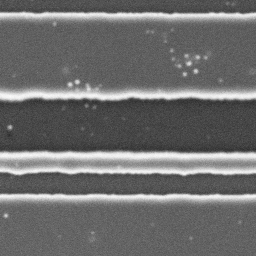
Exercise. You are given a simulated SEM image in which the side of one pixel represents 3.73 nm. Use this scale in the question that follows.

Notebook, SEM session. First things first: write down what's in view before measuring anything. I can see lines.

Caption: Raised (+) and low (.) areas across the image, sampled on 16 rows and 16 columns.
++++++++++++++++
++++++++++++++++
++++++++++++++++
++++++++++++++++
++++++++++++++++
++++++++++++++++
................
................
................
................
++++++++++++++++
++++++++++++++++
++++++++++++++++
++++++++++++++++
++++++++++++++++
++++++++++++++++